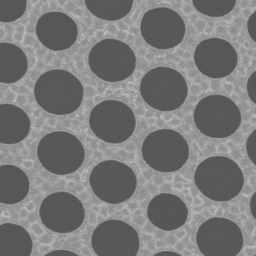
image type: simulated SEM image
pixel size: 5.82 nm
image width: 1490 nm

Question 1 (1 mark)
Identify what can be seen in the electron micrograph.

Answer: a regular array of holes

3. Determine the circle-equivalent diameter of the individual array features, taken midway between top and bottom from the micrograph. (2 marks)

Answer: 45.3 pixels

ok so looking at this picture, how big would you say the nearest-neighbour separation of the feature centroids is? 348 nanometres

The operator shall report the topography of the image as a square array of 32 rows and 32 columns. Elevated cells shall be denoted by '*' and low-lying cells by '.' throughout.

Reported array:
...********......*******.....***
...***.****.....**....***....***
..***....****..***.....********.
****......********.....********.
*****.....********.....********.
..***....***....***...***....***
...********......*******......**
...********......*******......**
...********......**..****....***
...**....***....**.....***..***.
****......********.....********.
****......*******......********.
****......********.....**....**.
..***.....**....***...**......**
...********......*******......**
....*******......*******......**
....***.****.....**...***....***
...**.....***...**.....********.
*****.....********......*******.
*****......*******......***.***.
*****.....**....**.....**.....**
...***...**......***.***......**
....*******......*******......**
....*******......********.....**
...***...***....****..****....*.
*****.....****.****....********.
*****......*******......*******.
*****.....****.****....***...***
...***....**.....***..***.....**
....*******......********.....**
....*******......********.....**
....**...***.....***..***.....**